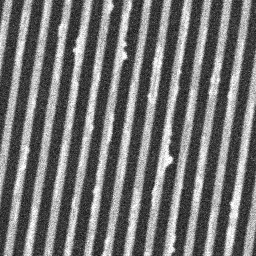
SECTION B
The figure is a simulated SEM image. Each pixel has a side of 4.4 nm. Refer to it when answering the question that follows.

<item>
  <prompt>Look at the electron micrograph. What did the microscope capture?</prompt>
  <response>parallel lines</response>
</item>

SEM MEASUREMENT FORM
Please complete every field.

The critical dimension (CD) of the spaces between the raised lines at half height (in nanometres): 59.7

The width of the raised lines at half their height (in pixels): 5.93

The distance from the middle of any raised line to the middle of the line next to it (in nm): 86.6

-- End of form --